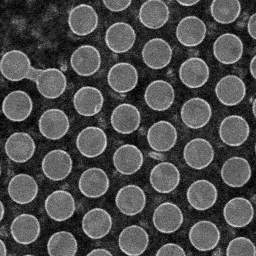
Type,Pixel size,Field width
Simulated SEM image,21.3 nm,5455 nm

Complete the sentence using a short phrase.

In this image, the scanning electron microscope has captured a regular array of raised bodies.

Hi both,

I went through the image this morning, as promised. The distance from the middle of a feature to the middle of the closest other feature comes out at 862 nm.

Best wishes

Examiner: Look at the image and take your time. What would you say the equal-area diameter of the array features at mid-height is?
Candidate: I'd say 616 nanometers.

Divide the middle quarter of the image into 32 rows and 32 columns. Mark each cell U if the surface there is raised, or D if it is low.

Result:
DDUUUUUUUDDDDUUUUDDDDUUUUDDDDDUU
DDDUUUUUDDDDUUUUUUDDDDDDDDDDDUUU
DDDDUUUDDDDUUUUUUUDDDDDDDDDDDUUU
DDDDDDDDDDDUUUUUUUDDDDDDDDDDDUUU
DDDDDDDDDDDUUUUUUUDDDDDUUDDDDDUU
DDDDDDDDDDDDUUUUUUDDDUUUUUUDDDDU
DDDDUUUUDDDDDUUUUDDDDUUUUUUDDDDD
DDDUUUUUUDDDDDDDDDDDUUUUUUUDDDDD
DDDUUUUUUDDDDDDDDDDDUUUUUUUDDDDD
DDUUUUUUUUDDDDDDDDDDDUUUUUUDDDDU
DDDUUUUUUDDDDDUUUDDDDUUUUUDDDDUU
DDDUUUUUUDDDDUUUUUDDDDDUUDDDDDUU
DDDDUUUUDDDDUUUUUUUDDDDDDDDDDUUU
UDDDDDDDDDDDUUUUUUUDDDDDDDDDDDUU
UDDDDDDDDDDDUUUUUUUDDDDDUDDDDDUU
UDDDDDDDDDDDUUUUUUDDDDUUUUUDDDDU
UDDDDUUUUDDDDUUUUUDDDUUUUUUUDDDD
DDDDUUUUUUDDDDDDDDDDDUUUUUUUDDDD
DDDDUUUUUUDDDDDDDDDDDUUUUUUUDDDD
DDDUUUUUUUUDDDDDDDDDDUUUUUUUDDDD
DDDUUUUUUUDDDDDUUDDDDDUUUUUDDDDU
DDDDUUUUUUDDDUUUUUUDDDDUUUDDDDUU
UDDDDUUUUDDDDUUUUUUDDDUDDDDDDDUU
UDDDDDDDDDDDDUUUUUUUDDDDDDDDDDUU
UUDDDDDDDDDDDUUUUUUDDDDDDDDDDDDU
UUDDDDDDDDDDDUUUUUUDDDDUUUUDDDDD
UUDDDDUUUDDDDUUUUUDDDDUUUUUUDDDD
UDDDDUUUUUDDDDDDDDDDDDUUUUUUUDDD
DDDDUUUUUUUDDDDDDDDDDDUUUUUUUDDD
DDDDUUUUUUUDDDDDDDDDDDUUUUUUUDDD
DDDDUUUUUUUDDDDDUUDDDDUUUUUUDDDD
DDDDUUUUUUDDDDUUUUUDDDDUUUUDDDDU